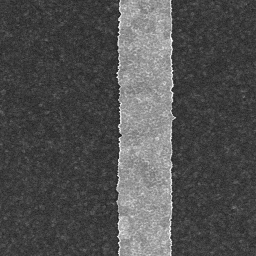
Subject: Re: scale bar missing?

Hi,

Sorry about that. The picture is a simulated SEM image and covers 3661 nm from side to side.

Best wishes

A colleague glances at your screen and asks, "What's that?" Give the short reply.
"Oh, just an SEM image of one or a few lines or trenches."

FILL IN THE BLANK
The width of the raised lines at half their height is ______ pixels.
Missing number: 52.9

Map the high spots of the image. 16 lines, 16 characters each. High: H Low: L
LLLLLLLHHHHLLLLL
LLLLLLLHHHHLLLLL
LLLLLLLHHHHLLLLL
LLLLLLLHHHHLLLLL
LLLLLLLHHHHLLLLL
LLLLLLLHHHHLLLLL
LLLLLLLHHHHLLLLL
LLLLLLLHHHHLLLLL
LLLLLLLLHHHLLLLL
LLLLLLLHHHHLLLLL
LLLLLLLHHHHLLLLL
LLLLLLLHHHHLLLLL
LLLLLLLHHHHLLLLL
LLLLLLLHHHHLLLLL
LLLLLLLHHHHLLLLL
LLLLLLLHHHHLLLLL